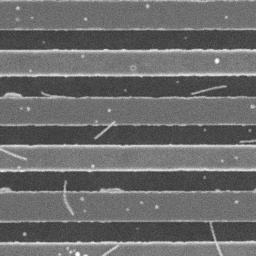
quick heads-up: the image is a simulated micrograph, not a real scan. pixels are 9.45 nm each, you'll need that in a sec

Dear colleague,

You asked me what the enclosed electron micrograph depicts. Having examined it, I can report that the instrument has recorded lines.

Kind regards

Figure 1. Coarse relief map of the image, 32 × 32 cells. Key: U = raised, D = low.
UUUUUUUUUUUUUUUUUUUUUUUUUUUUUUUU
UUUUUUUUUUUUUUUUUUUUUUUUUUUUUUUU
UUUUUUUUUUUUUUUUUUUUUUUUUUUUUUUU
UUUUUUUUUUUUUUUUUUUUUUUUUUUUUUUU
DDDDDDDDDDDDDDDDDDDDDDDDDDDDDDDD
DDDDDDDDDDDDDDDDDDDDDDDDDDDDDDDD
UUUUUUUUUUUUUUUUUUUUUUUUUUUUUUUU
UUUUUUUUUUUUUUUUUUUUUUUUUUUUUUUU
UUUUUUUUUUUUUUUUUUUUUUUUUUUUUUUU
DDDDDDDDDDDDDDDDDUDDDDDDDDDDDDDD
DDDDDDDDDDDDDDDDDDDDDDDDDDDDDDDD
DDDDDDDDDDDDDDDDDDDDDDDDDDDDDDDD
UUUUUUUUUUUUUUUUUUUUUUUUUUUUUUUU
UUUUUUUUUUUUUUUUUUUUUUUUUUUUUUUU
UUUUUUUUUUUUUUUUUUUUUUUUUUUUUUUU
UUUUUUUUUUUUUUUUUUUUUUUUUUUUUUUU
DDDDDDDDDDDDDDDDDDDDDDDDDDDDDDDD
DDDDDDDDDDDDDDDDDDDDDDDDDDDDDDDD
UUUUUUUUUUUUUUUUUUUUUUUUUUUUUUUU
UUUUUUUUUUUUUUUUUUUUUUUUUUUUUUUU
UUUUUUUUUUUUUUUUUUUUUUUUUUUUUUUU
DDDDDDDDDDDDDDDDDDDDDDDDDDDDDDDD
DDDDDDDDDDDDDDDDDDDDDDDDDDDDDDDD
DDDDDDDDDDDDDDDDDDDDDDDDDDDDDDDD
UUUUUUUUUUUUUUUUUUUUUUUUUUUUUUUU
UUUUUUUUUUUUUUUUUUUUUUUUUUUUUUUU
UUUUUUUUUUUUUUUUUUUUUUUUUUUUUUUU
UUUUUUUUUUUUUUUUUUUUUUUUUUUUUUUU
DDDDDDDDDDDDDDDDDDDDDDDDDDDDDDDD
DDDDDDDDDDDDDDDDDDDDDDDDDDDDDDDD
UUUUUUUUUUUUUUUUUUUUUUUUUUUUUUUU
UUUUUUUUUUUUUUUUUUUUUUUUUUUUUUUU